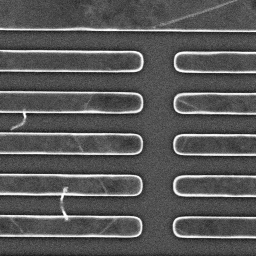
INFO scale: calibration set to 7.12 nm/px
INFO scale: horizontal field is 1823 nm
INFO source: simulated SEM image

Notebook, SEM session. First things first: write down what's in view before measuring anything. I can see groups of lines, slits or small figures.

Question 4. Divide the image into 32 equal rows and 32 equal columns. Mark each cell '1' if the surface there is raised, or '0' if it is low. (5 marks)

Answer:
11111111111111111111111111111111
11111111111111111111111111111111
11111111111111111111111111111111
11111111111111111111111111111111
00000000000000000000000000000000
00000000000000000000000000000000
11111110000000000000000000000000
11111111111111111100001111111111
11111111111111111000001111111111
00000000000000000000000000000000
00000000000000000000000000000000
00000000000000000000000000000000
11111111111111111100001111111111
11111111111111111100001111111111
00000000000000000000000000000000
00000000000000000000000000000000
00000000000000000000000000000000
11111111111111111100001111111111
11111111111111111100001111111111
00000000000000000000000000000000
00000000000000000000000000000000
00000000000000000000000000000000
11111111111111111100001111111111
11111111111111111100001111111111
00000000000000000000000000000101
00000000000000000000000000000000
00000000000000000000000000000000
11111111111111111000001111111111
11111111111111111100001111111111
00111111111111111000001111111111
00000000000000000000000000000000
00000000000000000000000000000000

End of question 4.